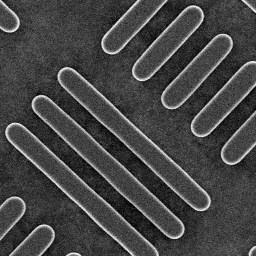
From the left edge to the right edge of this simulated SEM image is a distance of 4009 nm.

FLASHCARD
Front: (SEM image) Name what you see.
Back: groups of lines, slits or small figures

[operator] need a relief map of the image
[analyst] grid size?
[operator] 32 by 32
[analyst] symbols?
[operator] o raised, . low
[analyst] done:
o................ooo...........o
oo..............oooo...oo.......
oo.............oooo...ooo.......
oo............oooo...oooo.......
.............oooo...oooo...oo...
.............ooo...oooo...ooo...
.............oo...oooo...oooo...
.................oooo...oooo....
........o........ooo...oooo...oo
.......ooo.......oo...oooo...ooo
........ooo..........oooo...oooo
........oooo........oooo...oooo.
....oo....ooo.......ooo...oooo..
....ooo....ooo.......o...oooo...
.....oooo...oooo.........ooo...o
.o....oooo...oooo.......ooo...oo
.ooo...oooo...oooo......oo....oo
.oooo...oooo...oooo..........ooo
..oooo...oooo...oooo........oooo
...oooo...oooo...oooo.......ooo.
....oooo...oooo...oooo..........
.....oooo...oooo...oooo.........
......oooo...oooo...oooo........
.......oooo...oooo...oooo.......
........oooo...oooo...oooo......
ooo.......oooo..oooo....oo......
ooo........oooo...ooo...........
oo..........oooo...ooo..........
o....o.......oooo...ooo.........
...oooo.......oooo...oo.........
..oooo.........oooo.............
.oooo...........oooo...........o